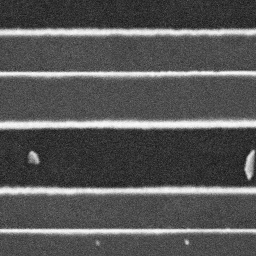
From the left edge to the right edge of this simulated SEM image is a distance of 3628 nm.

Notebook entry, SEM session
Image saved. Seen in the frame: lines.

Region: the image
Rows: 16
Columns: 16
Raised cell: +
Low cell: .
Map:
................
................
++++++++++++++++
++++++++++++++++
++++++++++++++++
++++++++++++++++
++++++++++++++++
++++++++++++++++
................
................
................
................
++++++++++++++++
++++++++++++++++
++++++++++++++++
++++++++++++++++